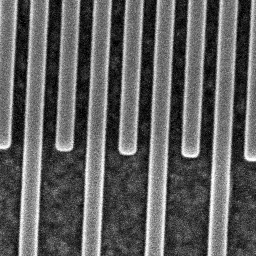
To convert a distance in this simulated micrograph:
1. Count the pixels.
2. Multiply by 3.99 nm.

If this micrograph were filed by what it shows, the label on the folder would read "parallel lines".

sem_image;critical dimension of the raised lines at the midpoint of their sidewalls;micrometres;0.0668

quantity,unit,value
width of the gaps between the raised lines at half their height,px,15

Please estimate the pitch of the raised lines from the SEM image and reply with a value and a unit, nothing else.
126 nm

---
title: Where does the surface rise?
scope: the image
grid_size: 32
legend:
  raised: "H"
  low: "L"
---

HHLLHHLLHHLLHHLLHHLLHHLLHHLLHHLL
HHLLHHLLHHLLHHLLHHLLHHLLHHLLHHLL
HHLLHHLLHHLLHHLLHHLLHHLLHHLHHLLH
HHLLHHLLHHLLHHLLHHLLHHLHHHLHHLLH
HHLLHHLLHHLLHHLLHHLLHHLHHHLHHLLH
HHLLHHLLHHLLHHLLHHLHHHLHHLLHHLLH
HHLLHHLLHHLHHHLHHLLHHLLHHLLHHLLH
HHLLHHLLHHLHHLLHHLLHHLLHHLLHHLLH
HHLLHHLLHHLHHLLHHLLHHLLHHLLHHLLH
HHLLHHLHHHLHHLLHHLLHHLLHHLLHHLLH
HHLHHLLHHLLHHLLHHLLHHLLHHLLHHLLH
HHLHHLLHHLLHHLLHHLLHHLLHHLLHHLLH
HHLHHLLHHLLHHLLHHLLHHLLHHLLHHLLH
HLLHHLLHHLLHHLLHHLLHHLLHHLLHHLLH
HLLHHLLHHLLHHLLHHLLHHLLHHLLHHLLH
HLLHHLLHHLLHHLLHHLLHHLLHHLLHHLLH
HLLHHLLHHLLHHLLHHLLHHLLHHLLHHLLH
HLLHHLLHHLLHHLLHHLLHHLLHHLLHHLLH
HLLHHLLHHLLHHLLHHLLHHLLHHLLHHLLH
LLLHHLLLLLLHHLLLLLLHHLLHLLLHHLLH
LLLHHLLLLLLHHLLLLLLHHLLLLLLHHLLL
LLLHHLLLLLLHHLLLLLLHHLLLLLLHHLLL
LLLHHLLLLLLHHLLLLLLHHLLLLLLHHLLL
LLLHHLLLLLLHHLLLLLLHHLLLLLHHHLLL
LLLHHLLLLLLHHLLLLLLHHLLLLLHHLLLL
LLLHHLLLLLLHHLLLLLLHHLLLLLHHLLLL
LLLHHLLLLLLHHLLLLLLHHLLLLLHHLLLL
LLLHHLLLLLLHHLLLLLHHLLLLLLHHLLLL
LLLHHLLLLLHHHLLLLLHHLLLLLLHHLLLL
LLLHHLLLLLHHHLLLLLHHLLLLLLHHLLLL
LLLHHLLLLLHHLLLLLLHHLLLLLLHHLLLL
LLHHLLLLLLHHLLLLLLHHLLLLLLHHLLLL